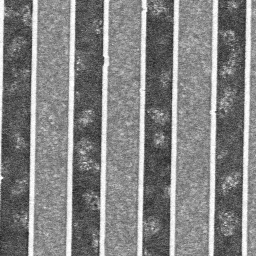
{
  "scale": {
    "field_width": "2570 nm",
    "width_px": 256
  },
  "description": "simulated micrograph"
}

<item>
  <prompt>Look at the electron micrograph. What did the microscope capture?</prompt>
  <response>one or a few lines or trenches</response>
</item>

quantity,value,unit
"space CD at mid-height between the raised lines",332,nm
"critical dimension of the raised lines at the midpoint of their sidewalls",0.371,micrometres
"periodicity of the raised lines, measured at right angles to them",712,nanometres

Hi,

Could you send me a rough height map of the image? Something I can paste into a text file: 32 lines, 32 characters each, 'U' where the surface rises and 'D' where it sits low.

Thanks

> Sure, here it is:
DDDDUUUUUDDDDUUUUUDDDDUUUUUDDDDU
DDDDUUUUUDDDDUUUUUDDDDUUUUUDDDDU
DDDDUUUUUDDDDUUUUUDDDDUUUUUDDDDU
DDDDUUUUUDDDDUUUUUDDDDUUUUUDDDDU
DDDDUUUUUDDDDUUUUUDDDDUUUUUDDDDU
DDDDUUUUUDDDDUUUUUDDDDUUUUUDDDDU
DDDDUUUUUDDDDUUUUUDDDDUUUUUDDDDU
DDDDUUUUUDDDDUUUUUDDDDUUUUUDDDDU
DDDDUUUUUDDDDUUUUUDDDDUUUUUDDDDU
DDDDUUUUUDDDDUUUUUDDDDUUUUUDDDDU
DDDDUUUUUDDDDUUUUUDDDDUUUUUDDDDU
DDDDUUUUUDDDDUUUUUDDDDUUUUUDDDDU
DDDDUUUUUDDDDUUUUUDDDDUUUUUDDDDU
DDDDUUUUUDDDDUUUUUDDDDUUUUUDDDDU
DDDDUUUUUDDDDUUUUUDDDDUUUUUDDDDU
DDDDUUUUUDDDDUUUUUDDDDUUUUUDDDDU
DDDDUUUUUDDDDUUUUUDDDDUUUUUDDDDU
DDDDUUUUUDDDDUUUUUDDDDUUUUUDDDDU
DDDDUUUUUDDDDUUUUUDDDDUUUUUDDDDU
DDDDUUUUUDDDDUUUUUDDDDUUUUUDDDDU
DDDDUUUUUDDDDUUUUUDDDDUUUUUDDDDU
DDDDUUUUUDDDDUUUUDDDDDUUUUDDDDDU
DDDDUUUUUDDDDUUUUDDDDDUUUUDDDDDU
DDDDUUUUUDDDDUUUUDDDDDUUUUDDDDDU
DDDDUUUUUDDDDUUUUDDDDDUUUUDDDDDU
DDDDUUUUUDDDDUUUUDDDDDUUUUDDDDDU
DDDDUUUUUDDDDUUUUDDDDDUUUUDDDDDU
DDDDUUUUUDDDDUUUUDDDDDUUUUDDDDDU
DDDDUUUUDDDDDUUUUDDDDDUUUUDDDDDU
DDDDUUUUDDDDDUUUUDDDDDUUUUDDDDDU
DDDDUUUUDDDDDUUUUDDDDDUUUUDDDDDU
DDDDUUUUDDDDDUUUUDDDDDUUUUDDDDDU